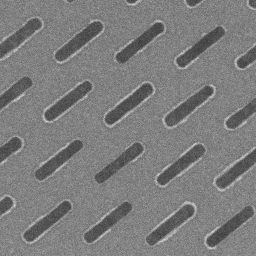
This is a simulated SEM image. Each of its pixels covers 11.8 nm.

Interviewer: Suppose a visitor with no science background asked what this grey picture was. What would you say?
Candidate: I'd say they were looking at a regular array of holes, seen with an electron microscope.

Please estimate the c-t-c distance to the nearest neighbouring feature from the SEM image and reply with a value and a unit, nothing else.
706 nanometers